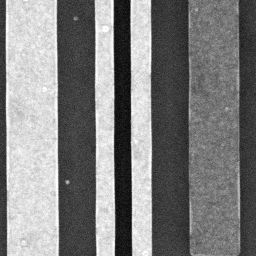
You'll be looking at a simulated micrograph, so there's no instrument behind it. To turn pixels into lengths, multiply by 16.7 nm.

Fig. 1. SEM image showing wiring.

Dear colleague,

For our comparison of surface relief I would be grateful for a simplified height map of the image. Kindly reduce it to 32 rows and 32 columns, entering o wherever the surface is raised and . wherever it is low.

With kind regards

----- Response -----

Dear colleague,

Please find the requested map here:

.oooooo.....oo..ooo.....oooooo..
.oooooo.....oo..ooo.....oooooo..
.oooooo.....oo..ooo.....oooooo..
.oooooo.....oo..ooo.....oooooo..
.oooooo.....oo..ooo.....oooooo..
.oooooo.....oo..ooo.....oooooo..
.oooooo.....oo..ooo.....oooooo..
.oooooo.....oo..ooo.....oooooo..
.oooooo.....oo..ooo.....oooooo..
.oooooo.....oo..ooo.....oooooo..
.oooooo.....oo..ooo.....oooooo..
.oooooo.....oo..ooo.....oooooo..
.oooooo.....oo..ooo.....oooooo..
.oooooo.....oo..ooo.....oooooo..
.oooooo.....oo..ooo.....oooooo..
.oooooo.....oo..ooo.....oooooo..
.oooooo.....oo..ooo.....oooooo..
.oooooo.....oo..ooo.....oooooo..
.oooooo.....oo..ooo.....oooooo..
.oooooo.....oo...oo.....oooooo..
.oooooo.....oo...oo.....oooooo..
.oooooo.....oo...oo.....oooooo..
.oooooo.....oo...oo.....oooooo..
.oooooo.....oo...oo.....oooooo..
.oooooo.....oo...oo.....oooooo..
.oooooo.....oo...oo.....oooooo..
.oooooo.....oo...oo.....oooooo..
.oooooo.....oo...oo.....oooooo..
.oooooo.....oo...oo.....oooooo..
.oooooo.....oo...oo.....oooooo..
.oooooo.....oo...oo.....oooooo..
.oooooo.....oo...oo.....oooooo..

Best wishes